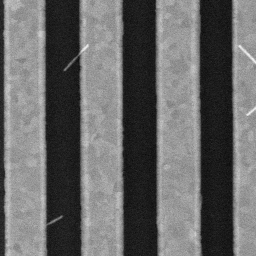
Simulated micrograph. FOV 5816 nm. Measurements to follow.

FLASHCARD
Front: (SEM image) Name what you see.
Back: lines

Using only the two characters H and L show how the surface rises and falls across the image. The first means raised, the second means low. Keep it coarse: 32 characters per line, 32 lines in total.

LHHHHLLLLLHHHHHLLLLLHHHHHLLLLHHH
LHHHHLLLLLHHHHHLLLLLHHHHHLLLLHHH
LHHHHLLLLLHHHHHLLLLLHHHHHLLLLHHH
LHHHHHLLLLHHHHHLLLLLHHHHHLLLLHHH
LHHHHHLLLLHHHHHLLLLLHHHHHLLLLHHH
LHHHHHLLLLHHHHHLLLLLHHHHHLLLLHHH
LHHHHHLLLLHHHHHLLLLLHHHHHLLLLHHH
LHHHHHLLLLHHHHHLLLLLHHHHHLLLLHHH
LHHHHHLLLLHHHHHLLLLLHHHHHLLLLHHH
LHHHHHLLLLHHHHHLLLLLHHHHHLLLLHHH
LHHHHHLLLLHHHHHLLLLLHHHHHLLLLHHH
LHHHHHLLLLHHHHHLLLLLHHHHHLLLLHHH
LHHHHHLLLLHHHHHLLLLLHHHHHLLLLHHH
LHHHHHLLLLHHHHHLLLLLHHHHHLLLLHHH
LHHHHHLLLLHHHHHLLLLLHHHHHLLLLHHH
LHHHHHLLLLHHHHHLLLLLHHHHHLLLLHHH
LHHHHHLLLLHHHHHLLLLLHHHHHLLLLHHH
LHHHHHLLLLHHHHHLLLLLHHHHHLLLLHHH
LHHHHHLLLLHHHHHLLLLLHHHHHLLLLHHH
LHHHHHLLLLHHHHHLLLLLHHHHHLLLLHHH
LHHHHHLLLLHHHHHLLLLLHHHHHLLLLHHH
LHHHHHLLLLHHHHHLLLLLHHHHHLLLLHHH
LHHHHHLLLLHHHHHLLLLLHHHHHLLLLHHH
LHHHHHLLLLHHHHHLLLLLHHHHHLLLLHHH
LHHHHHLLLLHHHHHLLLLLHHHHHLLLLHHH
LHHHHHLLLLHHHHHLLLLLHHHHHLLLLHHH
LHHHHHLLLLHHHHHLLLLLHHHHHLLLLHHH
LHHHHHLLLLHHHHHLLLLLHHHHHLLLLHHH
LHHHHHLLLLHHHHHLLLLLHHHHHLLLLHHH
LHHHHHLLLLHHHHHLLLLLHHHHHLLLLHHH
LHHHHHLLLLHHHHHLLLLLHHHHHLLLLHHH
LHHHHHLLLLHHHHHLLLLLHHHHHLLLLHHH